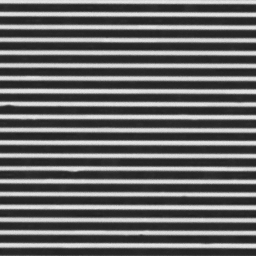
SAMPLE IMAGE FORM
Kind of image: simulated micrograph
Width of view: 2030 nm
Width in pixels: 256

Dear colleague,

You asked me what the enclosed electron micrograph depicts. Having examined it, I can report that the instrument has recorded parallel lines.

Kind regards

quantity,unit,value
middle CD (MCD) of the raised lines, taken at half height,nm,42.6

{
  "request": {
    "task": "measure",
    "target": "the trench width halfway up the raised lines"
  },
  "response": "57.5 nanometres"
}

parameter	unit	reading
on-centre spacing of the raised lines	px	12.8